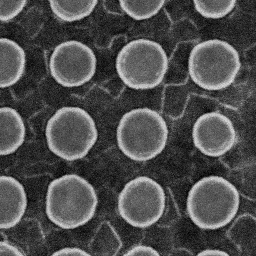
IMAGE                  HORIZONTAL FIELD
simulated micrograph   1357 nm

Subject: a regular array of raised bodies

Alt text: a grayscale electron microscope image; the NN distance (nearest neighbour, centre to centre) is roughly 362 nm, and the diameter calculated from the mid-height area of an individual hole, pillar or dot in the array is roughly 249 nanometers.